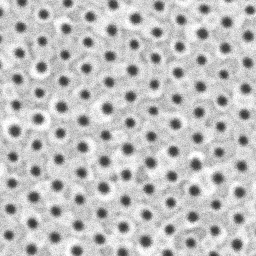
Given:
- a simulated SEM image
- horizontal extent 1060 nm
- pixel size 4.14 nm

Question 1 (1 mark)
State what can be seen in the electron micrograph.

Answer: a regular array of holes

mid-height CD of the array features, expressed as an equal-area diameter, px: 10.2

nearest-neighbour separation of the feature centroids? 0.106 microns